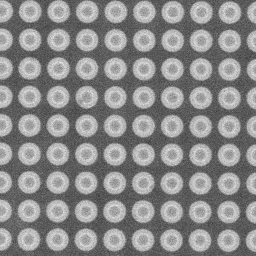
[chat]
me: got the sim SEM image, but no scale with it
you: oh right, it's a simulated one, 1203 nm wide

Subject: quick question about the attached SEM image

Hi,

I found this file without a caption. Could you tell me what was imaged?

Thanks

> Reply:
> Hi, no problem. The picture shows an array of small figures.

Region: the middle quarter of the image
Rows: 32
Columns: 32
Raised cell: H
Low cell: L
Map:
HLLHHHHHLLHHHHHHLHHHHHHLLHHHHHLL
HLLHHHHHLLHHHHHHLHHHHHHLHHHHHHLL
HLLHHHHHLLHHHHHLLHHHHHLLLHHHHHLL
LLLLHHHLLLLHHHLLLLHHHHLLLHHHHLLL
LLLLLLLLLLLLLLLLLLLLLLLLLLLLLLLL
LLLLLLLLLLLLLLLLLLLLLLLLLLLLLLLL
HLLLHHHHLLLHHHHLLLHHHHLLLHHHHLLL
HLLHHHHHLLHHHHHLLHHHHHHLHHHHHHLL
HLLHHHHHLLHHHHHLLHHHHHHLHHHHHHLL
HLLHHHHHLLHHHHHLLHHHHHLLLHHHHHLL
LLLLHHHLLLLHHHHLLLHHHHLLLHHHHLLL
LLLLLLLLLLLLLLLLLLLLLLLLLLLLLLLL
LLLLLLLLLLLLLLLLLLLLLLLLLLLLLLLL
LLLLHHHHLLLHHHHLLLHHHHLLLHHHHLLL
HLLHHHHHLLHHHHHLLHHHHHLLLHHHHHLL
HLLHHHHHLLHHHHHLLHHHHHHLHHHHHHLH
HLLHHHHHLLHHHHHLLHHHHHLLLHHHHHLL
LLLLHHHLLLLHHHHLLLHHHHLLLHHHHLLL
LLLLLLLLLLLLLLLLLLLLLLLLLLLLLLLL
LLLLLLLLLLLLLLLLLLLLLLLLLLLLLLLL
LLLLHHHLLLLHHHLLLLHHHHLLLHHHHLLL
HLLHHHHHLLHHHHHLLHHHHHLLLHHHHLLL
HLLHHHHHLLHHHHHLLHHHHHHLHHHHHHLH
HLLHHHHHLLHHHHHLLHHHHHHLHHHHHHLL
LLLLHHHLLLLHHHHLLLHHHHLLLHHHHLLL
LLLLLLLLLLLLLLLLLLLLLLLLLLLLLLLL
LLLLLLLLLLLLLLLLLLLLLLLLLLLLLLLL
LLLLHHHLLLLHHHLLLLHHHLLLLHHHLLLL
HLLHHHHHLLHHHHHLLHHHHHLLLHHHHLLL
HLLHHHHHLLHHHHHLLHHHHHHLHHHHHHLH
HLLHHHHHLLHHHHHLLHHHHHHLHHHHHHLH
HLLHHHHHLLLHHHHLLLHHHHLLLHHHHLLL